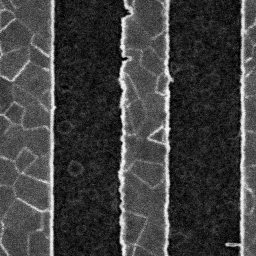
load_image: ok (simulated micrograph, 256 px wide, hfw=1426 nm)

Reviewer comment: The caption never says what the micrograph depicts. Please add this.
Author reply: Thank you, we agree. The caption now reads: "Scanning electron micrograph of one or a few lines or trenches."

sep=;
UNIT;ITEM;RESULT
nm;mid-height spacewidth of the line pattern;407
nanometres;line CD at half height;250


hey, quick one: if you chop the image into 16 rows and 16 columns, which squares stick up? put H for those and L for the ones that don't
HHHLLLLLHHLLLLLH
HHHLLLLLHHLLLLLH
HHHLLLLLHHHLLLLH
HHHLLLLLHHLLLLLH
HHHLLLLLHHLLLLLH
HHHLLLLLHHLLLLLH
HHHLLLLLHHLLLLLH
HHHLLLLLHHLLLLLH
HHHLLLLLHHLLLLLH
HHHLLLLLHHLLLLLH
HHHLLLLLHHLLLLLH
HHHLLLLLHHLLLLLH
HHHLLLLLHHLLLLLH
HHHLLLLLHHLLLLLH
HHHLLLLLHHLLLLLH
HHHLLLLLHHLLLLLH